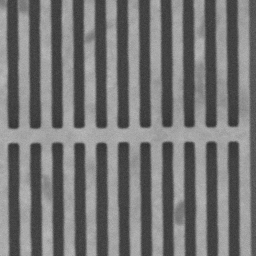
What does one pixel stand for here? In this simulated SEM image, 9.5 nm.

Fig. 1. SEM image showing groups of lines, slits or small figures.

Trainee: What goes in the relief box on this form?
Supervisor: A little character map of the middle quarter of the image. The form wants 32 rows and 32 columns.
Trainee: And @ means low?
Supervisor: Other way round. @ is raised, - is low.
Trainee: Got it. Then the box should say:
@@---@@@---@@---@@@---@@---@@@--
@@---@@@---@@---@@@---@@---@@@--
@@---@@@---@@---@@@---@@---@@@--
@@---@@@---@@---@@@---@@---@@@--
@@---@@@---@@---@@@---@@---@@@--
@@---@@@---@@---@@@---@@---@@@--
@@---@@@---@@---@@@---@@---@@@--
@@---@@@---@@---@@@---@@---@@@--
@@---@@@---@@---@@@---@@---@@@--
@@---@@@---@@---@@@---@@---@@@--
@@---@@@---@@---@@@---@@---@@@--
@@---@@@---@@---@@@---@@---@@@--
@@---@@@---@@---@@@---@@---@@@--
@@---@@@---@@----@@---@@---@@@--
@@---@@@---@@----@@---@@---@@@--
@@@--@@@---@@---@@@---@@@--@@@--
@@@@@@@@@@@@@@@@@@@@@@@@@@@@@@@@
@@@@@@@@@@@@@@@@@@@@@@@@@@@@@@@@
@@@@@@@@@@@@@@@@@@@@@@@@@@@@@@@@
@@@-@@@@@-@@@@--@@@@-@@@@--@@@@-
@@@--@@@---@@----@@---@@---@@@--
@@---@@@---@@----@@---@@---@@@--
@@---@@@---@@----@@---@@---@@@--
@@@--@@@---@@----@@---@@---@@@--
@@@--@@@---@@----@@---@@---@@@--
@@@--@@@---@@----@@---@@---@@@--
@@@--@@@---@@----@@---@@---@@@--
@@@--@@@---@@----@@---@@---@@@--
@@@--@@@---@@----@@---@@---@@@--
@@@--@@@---@@----@@---@@----@@--
@@@---@@---@@----@@---@@----@@--
@@@---@@---@@----@@---@@----@@--